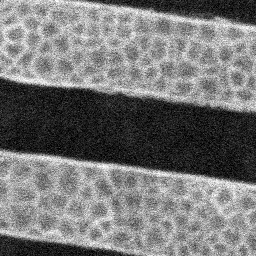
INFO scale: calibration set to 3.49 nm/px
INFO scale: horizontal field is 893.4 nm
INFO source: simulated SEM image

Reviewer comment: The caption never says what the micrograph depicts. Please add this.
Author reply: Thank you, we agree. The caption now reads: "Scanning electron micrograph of one or a few lines or trenches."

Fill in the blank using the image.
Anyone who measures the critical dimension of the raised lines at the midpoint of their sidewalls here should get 277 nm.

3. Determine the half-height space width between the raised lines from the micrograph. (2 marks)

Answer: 0.268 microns